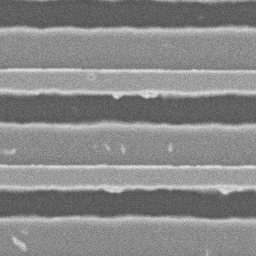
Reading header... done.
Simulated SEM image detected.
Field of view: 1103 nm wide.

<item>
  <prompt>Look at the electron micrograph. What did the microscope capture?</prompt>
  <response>lines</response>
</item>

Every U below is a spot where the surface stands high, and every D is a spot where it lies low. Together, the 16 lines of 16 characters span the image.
DDDDDDDDDDDDDDDD
DDDDDDDDDDDDDDDD
UUUUUUUUUUUUUUUU
UUUUUUUUUUUUUUUU
UUUUUUUUUUUUUUUU
UUUUUUUUUUUUUUUU
DDDDDDDDDDDDDDDD
DDDDDDDDDDDDDDDD
UUUUUUUUUUUUUUUU
UUUUUUUUUUUUUUUU
UUUUUUUUUUUUUUUU
UUUUUUUUUUUUUUUU
DDDDDDDDDDDDDDDD
DDDDDDDDDDDDDDDD
UUUUUUUUUUUUUUUU
UUUUUUUUUUUUUUUU